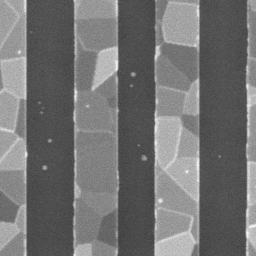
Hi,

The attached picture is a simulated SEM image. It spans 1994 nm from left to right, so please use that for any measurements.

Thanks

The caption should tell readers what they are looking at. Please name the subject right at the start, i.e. lines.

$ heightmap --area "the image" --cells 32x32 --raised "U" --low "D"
UUUDDDDDDUUUUUUDDDDDUUUUUDDDDDDU
UUUDDDDDDUUUUUUDDDDDUUUUUDDDDDDU
UUUDDDDDDUUUUUUDDDDDUUUUUDDDDDDU
UUUDDDDDDUUUUUUDDDDUUUUUUDDDDDDU
UUUDDDDDDUUUUUUDDDDDUUUUUDDDDDDU
UUUDDDDDDUUUUUUDDDDDUUUUUDDDDDDU
UUUDDDDDDUUUUUUDDDDDUUUUUDDDDDDU
UUUDDDDDDUUUUUUDDDDUUUUUUDDDDDDU
UUUDDDDDDUUUUUUDDDDUUUUUUDDDDDDU
UUUDDDDDDUUUUUUDDDDUUUUUUDDDDDDU
UUUDDDDDDUUUUUUDDDDUUUUUUDDDDDDU
UUUDDDDDDUUUUUUDDDDDUUUUUDDDDDDU
UUUDDDDDDUUUUUUDDDDDUUUUUDDDDDDU
UUUDDDDDDUUUUUUDDDDDUUUUUDDDDDDU
UUUDDDDDDUUUUUUDDDDUUUUUUDDDDDDU
UUUDDDDDDUUUUUUDDDDUUUUUUDDDDDDU
UUUDDDDDDUUUUUUDDDDUUUUUUDDDDDDU
UUUDDDDDDUUUUUUDDDDUUUUUUDDDDDDU
UUUDDDDDDUUUUUUDDDDUUUUUUDDDDDDU
UUUDDDDDDUUUUUUDDDDUUUUUUDDDDDDU
UUUDDDDDDUUUUUUDDDDUUUUUUDDDDDDU
UUUDDDDDDUUUUUUDDDDUUUUUUDDDDDDU
UUUDDDDDDUUUUUUDDDDUUUUUUDDDDDDU
UUUDDDDDDUUUUUUDDDDUUUUUUDDDDDDU
UUUDDDDDDUUUUUUDDDDUUUUUUDDDDDDU
UUUDDDDDDUUUUUUDDDDUUUUUUDDDDDDU
UUUDDDDDDUUUUUUDDDDUUUUUUDDDDDDU
UUUDDDDDDUUUUUUDDDDUUUUUUDDDDDDU
UUUDDDDDDUUUUUUDDDDUUUUUUDDDDDDU
UUUDDDDDDUUUUUUDDDDUUUUUUDDDDDDU
UUUDDDDDDUUUUUUDDDDUUUUUUDDDDDDU
UUUDDDDDDUUUUUUDDDDUUUUUUDDDDDDU